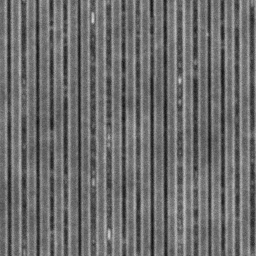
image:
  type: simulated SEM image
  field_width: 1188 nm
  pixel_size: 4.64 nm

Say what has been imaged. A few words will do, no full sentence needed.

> parallel lines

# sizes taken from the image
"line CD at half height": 40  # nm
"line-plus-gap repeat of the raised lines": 66.3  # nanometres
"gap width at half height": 27.8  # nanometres